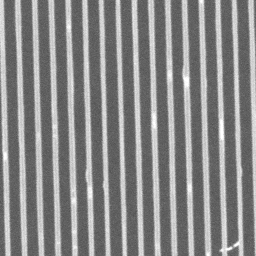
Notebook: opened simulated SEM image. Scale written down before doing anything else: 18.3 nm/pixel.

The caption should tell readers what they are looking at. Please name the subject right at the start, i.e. parallel lines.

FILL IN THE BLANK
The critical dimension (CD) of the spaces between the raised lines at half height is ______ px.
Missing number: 12.1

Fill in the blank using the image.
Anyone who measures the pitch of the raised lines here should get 304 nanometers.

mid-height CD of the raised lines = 84.6 nanometers